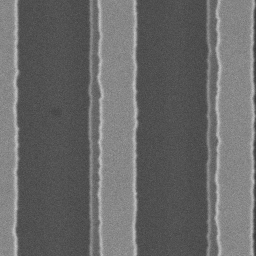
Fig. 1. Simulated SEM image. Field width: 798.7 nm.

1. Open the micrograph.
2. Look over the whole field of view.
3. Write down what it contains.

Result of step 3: lines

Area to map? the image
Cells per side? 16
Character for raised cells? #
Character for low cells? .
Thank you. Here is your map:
#.....##.....###
#.....###....###
#.....##.....###
#.....##.....###
#.....###....###
#.....##.....###
#.....###....###
#.....###....###
#.....##.....###
#.....##.....###
#.....##.....###
#.....##.....###
#.....###....###
#.....##.....###
#.....##.....###
#.....##.....###